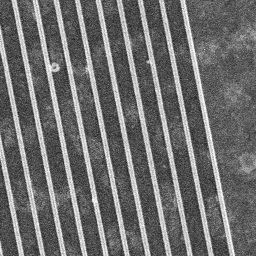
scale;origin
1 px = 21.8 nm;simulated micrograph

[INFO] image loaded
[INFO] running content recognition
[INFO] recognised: parallel lines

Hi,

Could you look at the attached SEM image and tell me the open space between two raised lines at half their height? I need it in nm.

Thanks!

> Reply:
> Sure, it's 369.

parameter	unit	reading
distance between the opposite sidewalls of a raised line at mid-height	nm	82.9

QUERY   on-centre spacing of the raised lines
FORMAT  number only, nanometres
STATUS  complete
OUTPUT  450